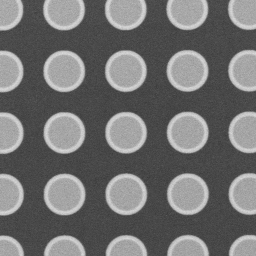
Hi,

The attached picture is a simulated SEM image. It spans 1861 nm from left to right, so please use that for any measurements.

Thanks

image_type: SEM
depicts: an array of small figures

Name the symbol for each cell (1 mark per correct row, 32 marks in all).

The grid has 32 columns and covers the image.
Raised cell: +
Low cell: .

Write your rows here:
+++..++++++..+++++...+++++...+++
+++..++++++..+++++...+++++...+++
+++...++++...+++++...+++++...+++
++.....++......++.....++......++
................................
................................
+......++......++.....++......++
++....++++....++++...+++++...+++
+++..++++++..+++++...+++++...+++
+++...+++++..+++++...+++++...+++
++....++++....++++...++++....+++
................................
................................
................................
++.....++.....+++.....+++.....++
+++...++++...+++++...+++++...+++
+++...+++++..+++++...+++++...+++
+++...++++...+++++...+++++...+++
++....++++....+++.....+++....+++
................................
................................
................................
++....++++....++++....+++....+++
+++...+++++..+++++...+++++...+++
+++...+++++..+++++...+++++...+++
+++...++++...+++++...+++++...+++
++.....++.....+++.....+++.....++
................................
................................
...............++......+......++
++....++++....++++...+++++...+++
+++...+++++..+++++...+++++...+++